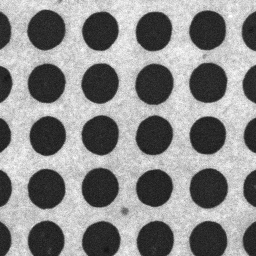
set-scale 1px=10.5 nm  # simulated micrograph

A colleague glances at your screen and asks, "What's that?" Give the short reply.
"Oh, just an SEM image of a regular array of holes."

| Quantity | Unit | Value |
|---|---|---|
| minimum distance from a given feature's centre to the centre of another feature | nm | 549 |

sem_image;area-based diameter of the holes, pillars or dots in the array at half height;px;38.5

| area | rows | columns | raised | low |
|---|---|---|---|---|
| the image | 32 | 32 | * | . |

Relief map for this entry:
********************************
*****..*****.******.*****..*****
.***....***...***....***....***.
.**.....**.....**.....**....**..
.***....**.....**....***....**..
.***...****...***....***....***.
********************************
********************************
.***...****...****...***....***.
.***....**.....**.....**....***.
..**....**.....**.....**....**..
.***....**.....**....***....**..
.****..****...****...****..****.
********************************
************.******.************
.***....***...****...***....***.
.***....**.....**.....**....***.
.***....**.....**.....**....***.
.***....***...***....***....***.
********************************
********************************
.****..****...****...****..****.
.***....**.....**....***....***.
.**.....**.....**.....**.....*..
.***....**.....**....***....***.
.***...****...****..*****..****.
********************************
********************************
.***....***....***...***....***.
.***....**.....**.....**....**..
.***....**.....**.....**....**..
.***....***....**....***....***.